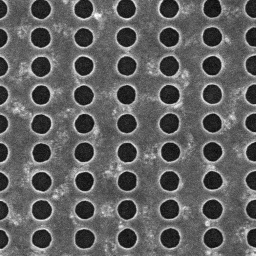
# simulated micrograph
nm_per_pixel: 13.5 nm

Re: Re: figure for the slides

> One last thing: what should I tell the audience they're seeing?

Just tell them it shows a regular array of holes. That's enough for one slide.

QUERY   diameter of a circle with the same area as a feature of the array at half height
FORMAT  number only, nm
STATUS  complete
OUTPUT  269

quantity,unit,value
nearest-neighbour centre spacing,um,0.386